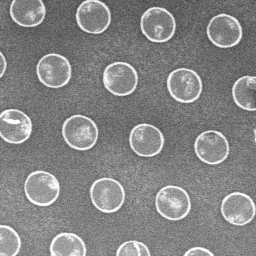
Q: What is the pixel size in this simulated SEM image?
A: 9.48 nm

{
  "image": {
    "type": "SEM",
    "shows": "a regular array of raised bodies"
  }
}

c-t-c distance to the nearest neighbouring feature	65.8	pixels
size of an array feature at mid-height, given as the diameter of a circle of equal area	314	nm